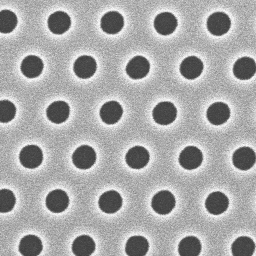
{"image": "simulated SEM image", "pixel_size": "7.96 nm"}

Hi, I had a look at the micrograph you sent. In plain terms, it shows a regular array of holes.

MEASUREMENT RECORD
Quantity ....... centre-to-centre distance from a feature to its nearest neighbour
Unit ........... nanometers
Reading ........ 412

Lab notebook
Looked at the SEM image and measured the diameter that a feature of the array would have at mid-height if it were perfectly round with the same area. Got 192 nm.